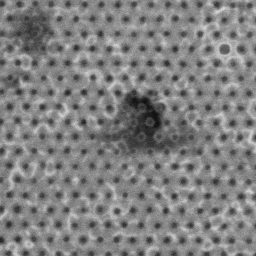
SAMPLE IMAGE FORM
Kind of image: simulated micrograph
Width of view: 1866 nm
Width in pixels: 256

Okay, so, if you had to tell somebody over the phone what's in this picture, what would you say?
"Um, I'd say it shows a regular array of raised bodies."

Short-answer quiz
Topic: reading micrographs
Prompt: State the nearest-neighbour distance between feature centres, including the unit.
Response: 16.1 px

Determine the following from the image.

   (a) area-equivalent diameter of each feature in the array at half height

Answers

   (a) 57.6 nm